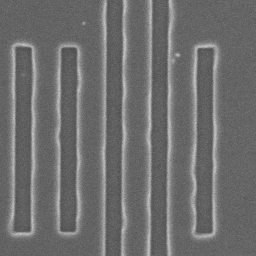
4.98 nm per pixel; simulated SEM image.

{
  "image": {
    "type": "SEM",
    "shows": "groups of lines, slits or small figures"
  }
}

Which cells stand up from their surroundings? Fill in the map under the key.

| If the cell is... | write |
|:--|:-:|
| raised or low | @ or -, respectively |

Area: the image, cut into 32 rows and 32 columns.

@@@@@@@@@@@@@---@@@--@@@@@@@@@@@
@@@@@@@@@@@@@--@@@@--@@@@@@@@@@@
@@@@@@@@@@@@@--@@@@--@@@@@@@@@@@
@@@@@@@@@@@@@--@@@@--@@@@@@@@@@@
@@@@@@@@@@@@@--@@@@--@@@@@@@@@@@
@@@@@@@@@@@@@---@@@--@@@@@@@@@@@
@@--@@@@--@@@--@@@@--@@@@--@@@@@
@@--@@@---@@@--@@@@--@@@@--@@@@@
@@--@@@---@@@--@@@@--@@@---@@@@@
@@--@@@---@@@--@@@@--@@@---@@@@@
@@--@@@---@@@--@@@@--@@@---@@@@@
@@--@@@---@@@--@@@@--@@@---@@@@@
@@--@@@---@@@--@@@@--@@@@--@@@@@
@@--@@@---@@@--@@@@--@@@@--@@@@@
@@--@@@---@@@--@@@@--@@@@--@@@@@
@@--@@@---@@@--@@@@--@@@---@@@@@
@@--@@@---@@@--@@@@--@@@---@@@@@
@@--@@@---@@@--@@@@--@@@---@@@@@
@@--@@@---@@@--@@@@--@@@---@@@@@
@@--@@@---@@@--@@@@--@@@---@@@@@
@@--@@@---@@@--@@@@--@@@---@@@@@
@@--@@@---@@@--@@@@--@@@---@@@@@
@@--@@@---@@@--@@@@--@@@---@@@@@
@@--@@@---@@@--@@@@--@@@---@@@@@
@@--@@@---@@@--@@@@--@@@---@@@@@
@@--@@@---@@@--@@@@--@@@---@@@@@
@@--@@@---@@@--@@@@--@@@---@@@@@
@@--@@@---@@@--@@@@--@@@---@@@@@
@---@@@---@@@--@@@@--@@@---@@@@@
@@@@@@@@@@@@@--@@@@--@@@@@@@@@@@
@@@@@@@@@@@@@--@@@@--@@@@@@@@@@@
@@@@@@@@@@@@@--@@@@--@@@@@@@@@@@